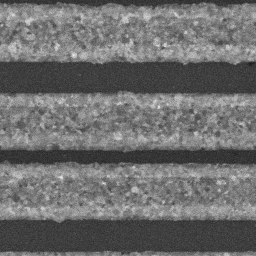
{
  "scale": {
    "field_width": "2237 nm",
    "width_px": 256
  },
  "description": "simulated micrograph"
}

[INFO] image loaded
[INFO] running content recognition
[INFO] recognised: one or a few lines or trenches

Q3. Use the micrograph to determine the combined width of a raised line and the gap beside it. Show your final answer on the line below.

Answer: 692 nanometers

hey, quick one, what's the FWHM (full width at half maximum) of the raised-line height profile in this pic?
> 352 nm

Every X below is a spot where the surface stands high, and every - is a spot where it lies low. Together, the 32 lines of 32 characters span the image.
--------------------------------
-------X------------X----------X
XXXXXXXXXXXXXXXXXXXXXXXXXXXXXXXX
XXXXXXXXXXXXXXXXXXXXXXXXXXXXXXXX
XXXXXXXXXXXXXXXXXXXXXXXXXXXXXXXX
XXXXXXXXXXXXXXXXXXXXXXXXXXXXXXXX
XX--XXXXXXXXXX--XXXXXXXXXXXXXXXX
--------------------------------
--------------------------------
--------------------------------
--------------------------------
--------------------------------
---------------XX---------------
XXXXXXXXXXXXXXXXXXXXXXXXXXXXXXXX
XXXXXXXXXXXXXXXXXXXXXXXXXXXXXXXX
XXXXXXXXXXXXXXXXXXXXXXXXXXXXXXXX
XXXXXXXXXXXXXXXXXXXXXXXXXXXXXXXX
XXXXXXXXXXXXXXXXXXXXXXXXXXXXXXXX
--------------------------------
--------------------------------
--------------------------------
XXXXXXXXX--XXXXX----XXX-X---XXX-
XXXXXXXXXXXXXXXXXXXXXXXXXXXXXXXX
XXXXXXXXXXXXXXXXXXXXXXXXXXXXXXXX
XXXXXXXXXXXXXXXXXXXXXXXXXXXXXXXX
XXXXXXXXXXXXXXXXXXXXXXXXXXXXXXXX
------XX------------------------
--------------------------------
--------------------------------
--------------------------------
--------------------------------
--------------------------------